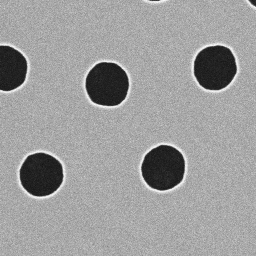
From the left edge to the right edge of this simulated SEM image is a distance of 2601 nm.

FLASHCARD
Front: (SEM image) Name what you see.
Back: holes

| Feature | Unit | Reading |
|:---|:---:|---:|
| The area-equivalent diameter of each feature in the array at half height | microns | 0.449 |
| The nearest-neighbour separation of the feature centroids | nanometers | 1060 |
